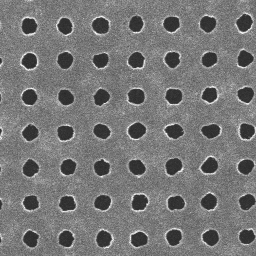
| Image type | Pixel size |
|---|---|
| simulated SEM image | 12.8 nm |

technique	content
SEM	a regular array of holes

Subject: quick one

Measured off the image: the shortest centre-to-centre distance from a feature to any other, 449 nm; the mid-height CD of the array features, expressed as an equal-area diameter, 205 nanometers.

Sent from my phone